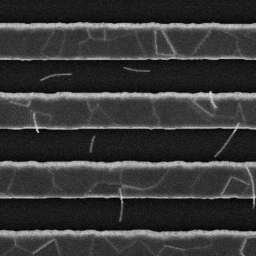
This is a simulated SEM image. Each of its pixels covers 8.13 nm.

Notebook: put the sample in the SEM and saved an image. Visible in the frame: lines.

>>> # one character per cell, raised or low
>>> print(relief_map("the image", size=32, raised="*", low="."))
................................
................................
................................
********************************
********************************
********************************
********************************
..**............................
................................
................................
................................
................................
********************************
********************************
********************************
********************************
................................
................................
................................
................................
********************************
********************************
********************************
********************************
********************************
................................
................................
................................
................................
********************************
********************************
********************************